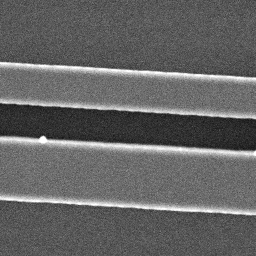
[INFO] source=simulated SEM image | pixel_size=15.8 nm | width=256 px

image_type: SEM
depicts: lines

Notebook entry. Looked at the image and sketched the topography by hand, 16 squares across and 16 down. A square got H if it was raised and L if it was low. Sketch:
LLLLLLLLLLLLLLLL
LLLLLLLLLLLLLLLL
LLLLLLLLLLLLLLLL
LLLLLLLLLLLLLLLL
HHHHHHHHHLLLLLLL
HHHHHHHHHHHHHHHH
LLHHHHHHHHHHHHHH
LLLLLLLLLLLLLLLL
LLLLLLLLLLLLLLLL
HHHHHHHHHHHHHHLL
HHHHHHHHHHHHHHHH
HHHHHHHHHHHHHHHH
LHHHHHHHHHHHHHHH
LLLLLLLLLLLLLLLL
LLLLLLLLLLLLLLLL
LLLLLLLLLLLLLLLL